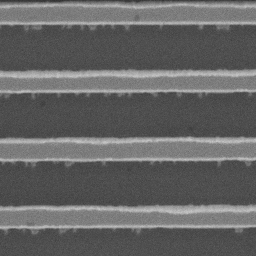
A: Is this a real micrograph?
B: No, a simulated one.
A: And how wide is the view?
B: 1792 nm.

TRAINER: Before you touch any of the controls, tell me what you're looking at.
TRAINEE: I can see lines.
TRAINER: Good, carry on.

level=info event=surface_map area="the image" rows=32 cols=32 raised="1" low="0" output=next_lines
01111111111111110111111111111111
11111111111111111111111111111111
11111111111111111111111111111111
00000000000000000000000000000000
00000000000000000000000000000000
00000000000000000000000000000000
00000000000000000000000000000000
00000000000000000000000000000000
00000000000000000000000000000000
11111111111111111111111111111111
11111111111111111111111111111111
11111111111111111000000000000000
00000000000000000000000000000000
00000000000000000000000000000000
00000000000000000000000000000000
00000000000000000000000000000000
00000000000000000000000000000000
00000001100000000111111111110111
11111111111111111111111111111111
11111111111111111111111111111111
00000000000000000000000000000000
00000000000000000000000000000000
00000000000000000000000000000000
00000000000000000000000000000000
00000000000000000000000000000000
00000000000000000000000000000000
11111111111111111111111111111111
11111111111111111111111111111111
00000000000000000000000000000000
00000000000000000000000000000000
00000000000000000000000000000000
00000000000000000000000000000000